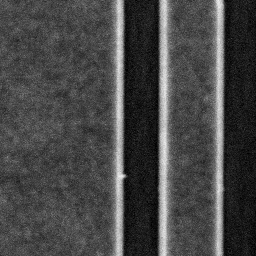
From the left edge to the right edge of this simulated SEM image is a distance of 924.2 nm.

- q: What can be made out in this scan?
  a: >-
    one or a few lines or trenches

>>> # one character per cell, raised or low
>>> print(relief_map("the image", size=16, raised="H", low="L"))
HHHHHHHHLLHHHHLL
HHHHHHHHLLHHHHLL
HHHHHHHHLLHHHHLL
HHHHHHHHLLHHHHLL
HHHHHHHHLLHHHHLL
HHHHHHHHLLHHHHLL
HHHHHHHHLLHHHHLL
HHHHHHHHLLHHHHLL
HHHHHHHLLLHHHHLL
HHHHHHHLLLHHHHLL
HHHHHHHHLLHHHHLL
HHHHHHHHLLHHHHLL
HHHHHHHLLLHHHHLL
HHHHHHHLLLHHHHLL
HHHHHHHLLLHHHHLL
HHHHHHHLLLHHHHLL